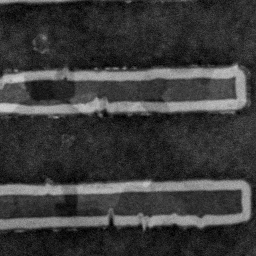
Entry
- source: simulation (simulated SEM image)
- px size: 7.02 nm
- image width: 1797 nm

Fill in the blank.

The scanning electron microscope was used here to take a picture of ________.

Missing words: one or a few lines or trenches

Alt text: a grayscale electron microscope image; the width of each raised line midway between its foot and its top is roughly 226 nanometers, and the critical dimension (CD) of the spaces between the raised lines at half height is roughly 572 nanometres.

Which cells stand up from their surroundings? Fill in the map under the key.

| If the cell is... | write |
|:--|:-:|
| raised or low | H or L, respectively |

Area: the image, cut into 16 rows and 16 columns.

LLLLLLLLLLLLLLLL
LLLLLLLLLLLLLLLL
LLLLLLLLLLLLLLLL
LLLLLLLLLLLLLLLL
LLLLLLLLLLLLLLLL
HHHHHHHHHHHHHHHL
HHHHHHHHHHHHHHLL
LLLLLLLLLLLLLLLL
LLLLLLLLLLLLLLLL
LLLLLLLLLLLLLLLL
LLLLLLLLLLLLLLLL
LLLLLLLLLLLLLLLL
HHHHHHHHHHHHHHHL
HHHHHHHHHHHHHHHL
LLLLLLLLLLLLLLLL
LLLLLLLLLLLLLLLL